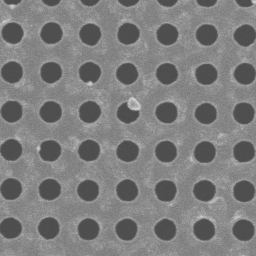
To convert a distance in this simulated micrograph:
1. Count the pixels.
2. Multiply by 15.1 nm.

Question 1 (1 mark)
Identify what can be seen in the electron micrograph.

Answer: a regular array of holes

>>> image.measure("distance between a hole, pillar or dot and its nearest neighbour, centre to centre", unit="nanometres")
582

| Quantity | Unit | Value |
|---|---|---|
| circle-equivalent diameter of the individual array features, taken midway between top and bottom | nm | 336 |